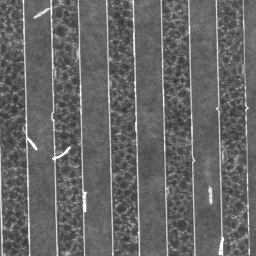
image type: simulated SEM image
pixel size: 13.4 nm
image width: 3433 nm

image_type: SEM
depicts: parallel lines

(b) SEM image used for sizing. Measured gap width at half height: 359 nm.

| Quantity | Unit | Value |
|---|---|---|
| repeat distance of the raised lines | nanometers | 737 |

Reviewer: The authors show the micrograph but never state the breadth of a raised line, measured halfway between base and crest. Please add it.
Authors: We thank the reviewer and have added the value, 0.37 micrometres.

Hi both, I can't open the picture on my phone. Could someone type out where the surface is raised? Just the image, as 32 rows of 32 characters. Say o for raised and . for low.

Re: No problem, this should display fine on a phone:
ooo...oooo...oooo...oooo...ooo..
ooo...oooo...oooo...oooo...ooo..
ooo...oooo...oooo...oooo...ooo..
ooo....ooo...oooo...oooo...ooo..
ooo....ooo...oooo...oooo...ooo..
ooo....ooo...oooo...oooo...oooo.
ooo....ooo...oooo...oooo...oooo.
ooo....ooo....ooo...oooo...oooo.
ooo....ooo....ooo...oooo...oooo.
ooo....ooo....ooo...oooo...oooo.
ooo....ooo....ooo...oooo...oooo.
ooo....ooo....ooo...oooo...oooo.
ooo....ooo....ooo...oooo...oooo.
ooo....ooo....ooo...oooo...oooo.
ooo....ooo....ooo...oooo...oooo.
ooo....ooo....ooo....ooo...oooo.
ooo....ooo....ooo....ooo...oooo.
ooo....ooo....ooo....ooo...oooo.
ooo....ooo....ooo....ooo...oooo.
ooo....ooo....ooo....ooo....ooo.
ooo....ooo....ooo....ooo....ooo.
ooo....ooo....ooo....ooo....ooo.
ooo....ooo....ooo....ooo....ooo.
ooo....ooo....ooo....ooo....ooo.
ooo....ooo....ooo....ooo....ooo.
oooo...ooo....ooo....ooo....ooo.
oooo...ooo....ooo....ooo....ooo.
oooo...ooo....ooo....ooo....ooo.
oooo...ooo....ooo....ooo....ooo.
oooo...oooo...ooo....ooo....ooo.
oooo...oooo...ooo....ooo....ooo.
oooo...oooo...ooo....ooo....ooo.